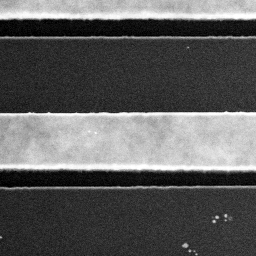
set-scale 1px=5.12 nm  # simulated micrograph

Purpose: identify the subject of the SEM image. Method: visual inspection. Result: lines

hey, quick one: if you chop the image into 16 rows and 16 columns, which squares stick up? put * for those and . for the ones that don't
****************
................
................
................
................
................
................
****************
****************
****************
****************
................
................
................
................
................